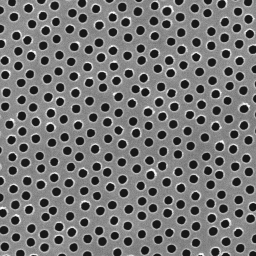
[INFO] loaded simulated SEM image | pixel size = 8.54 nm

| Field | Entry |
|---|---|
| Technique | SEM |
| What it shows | a regular array of holes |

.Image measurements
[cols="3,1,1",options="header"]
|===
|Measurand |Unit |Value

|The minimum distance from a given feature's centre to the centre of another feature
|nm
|119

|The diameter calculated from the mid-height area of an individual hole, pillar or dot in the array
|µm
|0.0728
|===